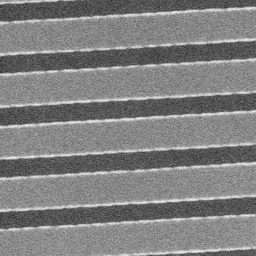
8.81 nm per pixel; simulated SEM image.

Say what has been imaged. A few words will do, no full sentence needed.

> lines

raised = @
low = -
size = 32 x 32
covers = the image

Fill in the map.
--------------------------------
---------------------@@@@@@@@@@@
-----@@@@@@@@@@@@@@@@@@@@@@@@@@@
@@@@@@@@@@@@@@@@@@@@@@@@@@@@@@@@
@@@@@@@@@@@@@@@@@@@@@@@@@@@@@@@@
@@@@@@@@@@@@@@@@@@@@@@@@--------
@@@@@@@-------------------------
-------------------------------@
--------------@@@@@@@@@@@@@@@@@@
@@@@@@@@@@@@@@@@@@@@@@@@@@@@@@@@
@@@@@@@@@@@@@@@@@@@@@@@@@@@@@@@@
@@@@@@@@@@@@@@@@@@@@@@@@@@@@@@@@
@@@@@@@@@@@@@@------------------
--------------------------------
---------------------@@@@@@@@@@@
-----@@@@@@@@@@@@@@@@@@@@@@@@@@@
@@@@@@@@@@@@@@@@@@@@@@@@@@@@@@@@
@@@@@@@@@@@@@@@@@@@@@@@@@@@@@@@@
@@@@@@@@@@@@@@@@@@@@@@@@--------
@@@@@@@-------------------------
-----------------------------@@@
--------------@@@@@@@@@@@@@@@@@@
@@@@@@@@@@@@@@@@@@@@@@@@@@@@@@@@
@@@@@@@@@@@@@@@@@@@@@@@@@@@@@@@@
@@@@@@@@@@@@@@@@@@@@@@@@@@@@@@@@
@@@@@@@@@@@@@@@@----------------
--------------------------------
---------------------@@@@@@@@@@@
--@@@@@@@@@@@@@@@@@@@@@@@@@@@@@@
@@@@@@@@@@@@@@@@@@@@@@@@@@@@@@@@
@@@@@@@@@@@@@@@@@@@@@@@@@@@@@@@@
@@@@@@@@@@@@@@@@@@@@@@@@--------